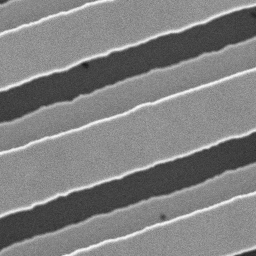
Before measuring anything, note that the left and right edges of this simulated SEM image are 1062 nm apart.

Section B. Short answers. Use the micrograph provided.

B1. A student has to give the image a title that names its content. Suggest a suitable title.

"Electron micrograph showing lines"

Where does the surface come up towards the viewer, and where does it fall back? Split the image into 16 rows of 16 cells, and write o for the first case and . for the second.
ooooooooooooooo.
ooooooooooooo...
ooooooooo.......
oooooo.......ooo
oooo.....ooooooo
o.....oooooooooo
....oooooooooooo
.ooooooooooooooo
ooooooooooooooo.
oooooooooooo....
ooooooooo......o
oooooo......oooo
ooo......ooooooo
......oooooooooo
...ooooooooooooo
oooooooooooooooo